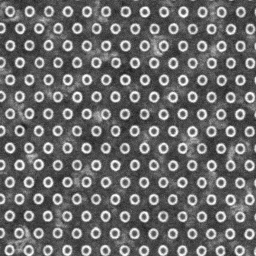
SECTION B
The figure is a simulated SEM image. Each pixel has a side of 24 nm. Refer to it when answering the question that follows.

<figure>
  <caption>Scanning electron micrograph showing a regular array of raised bodies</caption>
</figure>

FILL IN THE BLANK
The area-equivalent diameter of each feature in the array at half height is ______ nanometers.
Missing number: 215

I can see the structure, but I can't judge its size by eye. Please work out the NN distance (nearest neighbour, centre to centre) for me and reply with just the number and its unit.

0.456 micrometres